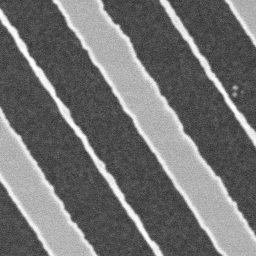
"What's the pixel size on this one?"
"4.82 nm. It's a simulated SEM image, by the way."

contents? lines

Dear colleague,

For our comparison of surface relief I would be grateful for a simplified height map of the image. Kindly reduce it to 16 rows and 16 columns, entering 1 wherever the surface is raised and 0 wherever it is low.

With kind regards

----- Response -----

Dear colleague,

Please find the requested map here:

0000110000000011
0000111000000001
0000011100000000
0000001100000000
0000001110000000
0000000111000000
0000000011000000
0000000011100000
1000000001110000
1100000000110000
1100000000111000
1110000000011100
0111000000001100
0011000000001110
0011100000000111
0001110000000011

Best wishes